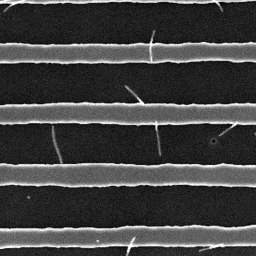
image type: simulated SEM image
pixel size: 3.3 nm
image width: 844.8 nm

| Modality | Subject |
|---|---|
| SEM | lines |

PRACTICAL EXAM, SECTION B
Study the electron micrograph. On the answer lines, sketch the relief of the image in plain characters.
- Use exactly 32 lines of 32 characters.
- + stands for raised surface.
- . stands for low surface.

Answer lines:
.+..............................
................................
................................
................................
................................
+++..............+++...+++++++++
++++++++++++++++++++++++++++++++
++++++++++++++++++++++++++++++++
................................
................................
................................
................................
................................
++++++++++++++++++++++++++++++++
++++++++++++++++++++++++++++++++
+..............++++++++......+++
................................
................................
................................
................................
+........+++++++....++..........
++++++++++++++++++++++++++++++++
++++++++++++++++++++++++++++++++
................................
................................
................................
................................
................................
......+.++++..++++++++++++++++++
++++++++++++++++++++++++++++++++
++++++++++++++++++++++++++++++++
................................